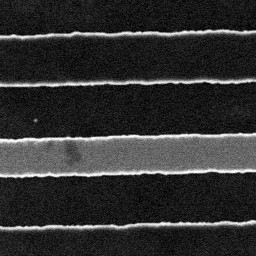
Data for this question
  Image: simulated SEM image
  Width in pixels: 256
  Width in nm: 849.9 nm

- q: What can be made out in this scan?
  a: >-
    lines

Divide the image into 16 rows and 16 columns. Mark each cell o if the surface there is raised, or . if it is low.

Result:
................
................
oooooooooooooooo
oooooooooooooooo
oooooooooooooooo
................
................
................
........o.oooooo
oooooooooooooooo
oooooooooooooooo
................
................
................
oooooooooooooooo
oooooooooooooooo